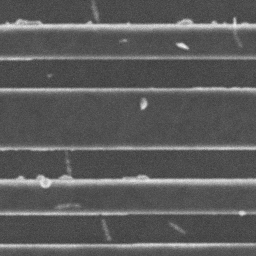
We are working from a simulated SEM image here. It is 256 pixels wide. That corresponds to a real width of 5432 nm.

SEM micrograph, lines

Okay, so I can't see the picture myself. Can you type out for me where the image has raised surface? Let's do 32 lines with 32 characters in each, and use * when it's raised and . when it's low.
................................
................................
................................
********************************
********************************
********************************
********************************
................................
................................
................................
................................
********************************
********************************
********************************
********************************
********************************
********************************
********************************
********************************
................................
................................
................................
.....*..........................
********************************
********************************
********************************
********************************
................................
................................
................................
................................
********************************